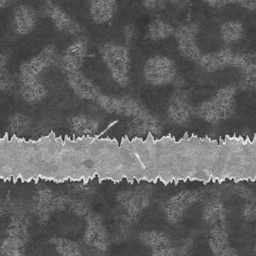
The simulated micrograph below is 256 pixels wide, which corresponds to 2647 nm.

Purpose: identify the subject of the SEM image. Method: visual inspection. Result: one or a few lines or trenches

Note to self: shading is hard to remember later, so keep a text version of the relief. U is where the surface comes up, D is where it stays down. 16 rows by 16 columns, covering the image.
DDDDDDDDDDDDDDDD
DDDDDDDDDDDDDDDD
DDDDDDDDDDDDDDDD
DDDDDDDDDDDDDDDD
DDDDDDDDDDDDDDDD
DDDDDDDDDDDDDDDD
DDDDDDDDDDDDDDDD
DDDDDDDDDDDDDDDD
DDDDDDDDDDDDDDDD
UUUUUUUUUUUUUUUU
UUUUUUUUUUUUUUUU
DDDDDDDDDDDDDDDD
DDDDDDDDDDDDDDDD
DDDDDDDDDDDDDDDD
DDDDDDDDDDDDDDDD
DDDDDDDDDDDDDDDD